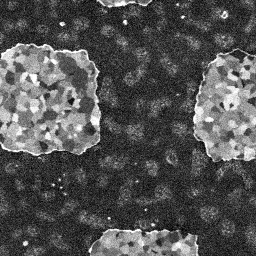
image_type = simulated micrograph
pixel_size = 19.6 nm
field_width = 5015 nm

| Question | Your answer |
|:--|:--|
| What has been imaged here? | raised bodies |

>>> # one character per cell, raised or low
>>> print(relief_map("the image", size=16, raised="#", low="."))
................
................
................
#####.........##
######.......###
######.......###
######......####
######......####
######......####
..#.#........###
................
................
................
................
.......####.....
......######....